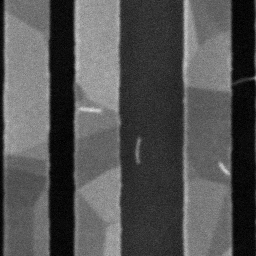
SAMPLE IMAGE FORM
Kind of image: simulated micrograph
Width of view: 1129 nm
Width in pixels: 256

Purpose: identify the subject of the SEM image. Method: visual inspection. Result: lines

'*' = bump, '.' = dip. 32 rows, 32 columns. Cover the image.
.*****...******........******...
.*****...******........******...
.*****...******........******...
.*****...******........******...
.*****...******........******...
.*****...******........******...
.*****...******........******...
.*****...******........******...
.*****...******........******...
.*****...******........******...
.*****...******........******...
******...******........******...
******...******........******...
******...******........******...
******...******........******...
.*****...******........******...
.*****...******........******...
******...******........******...
******...******........******...
******...******........******...
******...******........******...
******...******........******...
******...******........******...
******...******........******...
******...******........******...
******...******........******...
******...******........******...
******...******........******...
******...******........******...
******...******........******...
******...******........******...
******...******........******...